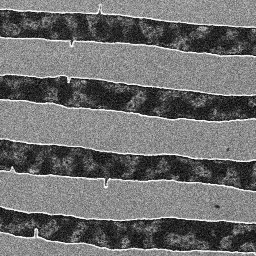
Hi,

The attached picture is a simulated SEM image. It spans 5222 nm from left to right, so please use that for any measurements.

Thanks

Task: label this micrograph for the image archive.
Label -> one or a few lines or trenches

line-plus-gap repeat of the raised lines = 1360 nanometers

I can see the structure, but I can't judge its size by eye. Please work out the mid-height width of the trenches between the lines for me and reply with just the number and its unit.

554 nanometers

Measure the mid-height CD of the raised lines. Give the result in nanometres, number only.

804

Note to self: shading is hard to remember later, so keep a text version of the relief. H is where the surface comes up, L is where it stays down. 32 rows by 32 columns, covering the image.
HHHHHHHHHHHHHHHHHHHHHHHHHHHHHHHH
LLLLLLHHHHHHHHHHHHHHHHHHHHHHHHHH
LLLLLLLLLLLLLLLLLLLLHHHHHHHHHHHH
LLLLLLLLLLLLLLLLLLLLLLLLLLLLLLLL
LLLLLLLLLLLLLLLLLLLLLLLLLLLLLLLL
HHHHHHHHHHHHHHHHLLLLLLLLLLLLLLLL
HHHHHHHHHHHHHHHHHHHHHHHHLLLLLLLL
HHHHHHHHHHHHHHHHHHHHHHHHHHHHHHHH
HHHHHHHHHHHHHHHHHHHHHHHHHHHHHHHH
LLLHHHHHHHHHHHHHHHHHHHHHHHHHHHHH
LLLLLLLLLLLLLLLLHHHHHHHHHHHHHHHH
LLLLLLLLLLLLLLLLLLLLLLLLLHHHHHHH
HLLLLLLLLLLLLLLLLLLLLLLLLLLLLLLL
HHHHHHHHHHLLLLLLLLLLLLLLLLLLLLLL
HHHHHHHHHHHHHHHHHHHLLLLLLLLLLLLL
HHHHHHHHHHHHHHHHHHHHHHHHHHHHHHHH
HHHHHHHHHHHHHHHHHHHHHHHHHHHHHHHH
LHHHHHHHHHHHHHHHHHHHHHHHHHHHHHHH
LLLLLLLLLLLHHHHHHHHHHHHHHHHHHHHH
LLLLLLLLLLLLLLLLLLLLLLLHHHHHHHHH
LLLLLLLLLLLLLLLLLLLLLLLLLLLLLLLL
HHLLLLLLLLLLLLLLLLLLLLLLLLLLLLLL
HHHHHHHHHHHHHLHHLLLLLLLLLLLLLLLL
HHHHHHHHHHHHHHHHHHHHHHHHHHHHHLLL
HHHHHHHHHHHHHHHHHHHHHHHHHHHHHHHH
HHHHHHHHHHHHHHHHHHHHHHHHHHHHHHHH
LLLHHHHHHHHHHHHHHHHHHHHHHHHHHHHH
LLLLLLLLLLLLLLHHLLLLLLLLLHHHHHHH
LLLLLLLLLLLLLLLLLLLLLLLLLLLLLLLL
HHLLHLLLLLLLLLLLLLLLLLLLLLLLLLLL
HHHHHHHHHHHLLLLLLLLLLLLLLLLLLLLL
HHHHHHHHHHHHHHHHHHHHHHHHHHHHHLLL